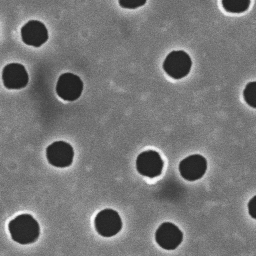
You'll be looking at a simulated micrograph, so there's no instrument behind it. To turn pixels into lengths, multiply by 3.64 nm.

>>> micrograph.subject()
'a regular array of holes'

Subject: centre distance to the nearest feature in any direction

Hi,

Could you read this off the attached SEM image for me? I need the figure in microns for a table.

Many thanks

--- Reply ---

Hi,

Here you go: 0.214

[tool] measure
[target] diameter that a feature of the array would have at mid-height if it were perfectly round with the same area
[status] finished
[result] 98.8 nm